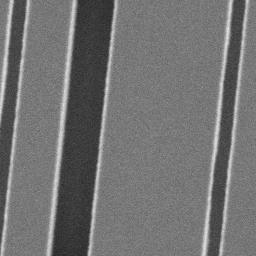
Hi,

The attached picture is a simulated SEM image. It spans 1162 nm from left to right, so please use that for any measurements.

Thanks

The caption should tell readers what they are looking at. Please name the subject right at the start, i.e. lines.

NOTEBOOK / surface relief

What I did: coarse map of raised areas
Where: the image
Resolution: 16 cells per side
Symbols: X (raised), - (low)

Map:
XXXXX--XXXXXXXXX
XXXXX--XXXXXXXXX
XXXX---XXXXXXXXX
XXXX---XXXXXXXXX
XXXX---XXXXXXXXX
XXXX---XXXXXXXXX
XXXX---XXXXXXXXX
XXXX--XXXXXXXXXX
XXXX--XXXXXXXXXX
XXXX--XXXXXXXXXX
XXXX--XXXXXXXXXX
XXXX--XXXXXXXXXX
XXX---XXXXXXXXXX
XXX---XXXXXXXXXX
XXX---XXXXXXXXXX
XXX---XXXXXXXXXX